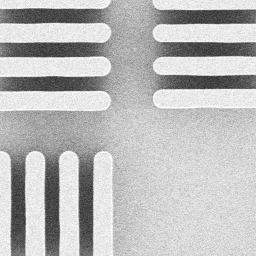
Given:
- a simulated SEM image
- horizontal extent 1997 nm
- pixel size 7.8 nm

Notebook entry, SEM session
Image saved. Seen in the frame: groups of lines, slits or small figures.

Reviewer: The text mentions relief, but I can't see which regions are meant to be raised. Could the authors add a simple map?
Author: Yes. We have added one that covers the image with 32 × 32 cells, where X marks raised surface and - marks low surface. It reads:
XXXXXXXXXXXXXX-----XXXXXXXXXXXXX
--------------------------------
--------------------------------
XXXXXXXXXXXXXX-----XXXXXXXXXXXXX
XXXXXXXXXXXXXX-----XXXXXXXXXXXXX
--------------------------------
--------------------------------
XXXXXXXXXXXXX-------XXXXXXXXXXXX
XXXXXXXXXXXXXX-----XXXXXXXXXXXXX
XXXXXX-XXXXX--------------------
--------------------------------
--XXXX-XXXXXX-------XXXXXXXXXXXX
XXXXXXXXXXXXXX-----XXXXXXXXXXXXX
XXXXXXXXXXXXX-------------------
--------------------------------
--------------------------------
--------------------------------
--------------------------------
--------------------------------
X--XX---XX--XX------------------
X--XXX-XXX--XX------------------
X--XXX-XXX--XX------------------
X--XXX-XXX--XX------------------
X--XX--XXX--XX------------------
X--XX--XXX--XX------------------
X--XX--XXX--XX------------------
X--XXX-XXX--XX------------------
X--XXX-XXX--XX------------------
X--XXX-XXX--XX------------------
X--XXX--XX--XX------------------
X--XXX-XXX--XX------------------
X--XXX-XXX--XX------------------